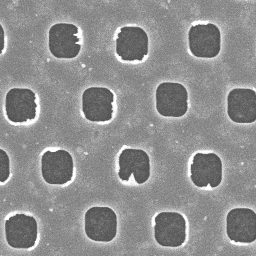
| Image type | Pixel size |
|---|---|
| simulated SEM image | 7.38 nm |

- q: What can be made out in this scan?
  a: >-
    a regular array of holes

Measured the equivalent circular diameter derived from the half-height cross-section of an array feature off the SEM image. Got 255 nanometres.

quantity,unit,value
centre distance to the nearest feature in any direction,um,0.509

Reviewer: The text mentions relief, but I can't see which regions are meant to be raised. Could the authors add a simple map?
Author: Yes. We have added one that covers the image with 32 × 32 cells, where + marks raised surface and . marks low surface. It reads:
++++++++++++++++++++++++++++++++
++++++++++++++++++++++++++++++++
++++++++++++++++++++++++++++++++
++++++....+++++...++++++...+++++
.+++++....+++++...++++++....++++
++++++....++++.....+++++....++++
++++++....+++++...++++++...+++++
++++++++++++++++.+++++++++++++++
++++++++++++++++++++++++++++++++
++++++++++++++++++++++++++++++++
++++++++++++++++++++...+++++++++
+...+++++++...+++++....++++++...
+...++++++....+++++....+++++....
+...++++++....++++++...+++++....
+...+++++++...++++++...++++++...
++++++++++++++++++++++++++++++++
++++++++++++++++++++++++++++++++
++++++++++++++++++++++++++++++++
++++++++++++++++++++++++++++++++
.++++....++++++....+++++...+++++
.++++....++++++....+++++....++++
.++++....++++++....+++++....++++
.+++++...++++++++.++++++....++++
++++++++++++++++++++++++++++++++
++++++++++++++++++++++++++++++++
++++++++++++++++++++++++++++++++
+++++++++++...+++++++++++++++...
+...+++++++....++++....+++++....
+....++++++....++++....+++++....
+....++++++...+++++....++++++...
+...++++++++++++++++...+++++++++
++++++++++++++++++++++++++++++++